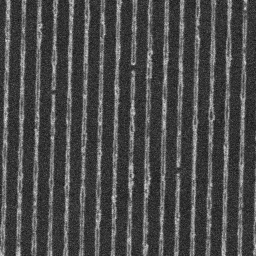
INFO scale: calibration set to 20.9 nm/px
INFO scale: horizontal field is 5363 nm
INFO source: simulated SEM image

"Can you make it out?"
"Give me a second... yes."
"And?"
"parallel lines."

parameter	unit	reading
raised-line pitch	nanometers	331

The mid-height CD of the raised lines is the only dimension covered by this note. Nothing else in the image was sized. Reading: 60.2 nm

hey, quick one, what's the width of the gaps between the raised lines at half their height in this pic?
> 264 nm